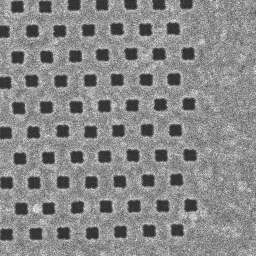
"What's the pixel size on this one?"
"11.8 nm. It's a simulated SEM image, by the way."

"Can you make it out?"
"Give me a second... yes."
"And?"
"a regular array of holes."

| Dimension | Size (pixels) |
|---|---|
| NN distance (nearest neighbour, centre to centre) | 28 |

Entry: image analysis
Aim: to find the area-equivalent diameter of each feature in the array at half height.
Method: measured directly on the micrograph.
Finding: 161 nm